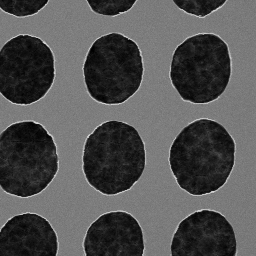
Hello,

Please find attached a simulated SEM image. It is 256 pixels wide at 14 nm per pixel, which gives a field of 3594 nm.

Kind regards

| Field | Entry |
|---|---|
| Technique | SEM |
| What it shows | holes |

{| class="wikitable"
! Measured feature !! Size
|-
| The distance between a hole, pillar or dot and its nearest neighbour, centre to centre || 88.2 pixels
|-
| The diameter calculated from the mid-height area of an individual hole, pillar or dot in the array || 929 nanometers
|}